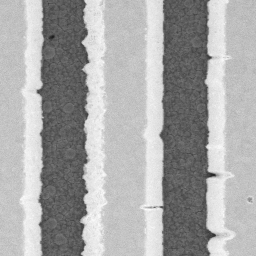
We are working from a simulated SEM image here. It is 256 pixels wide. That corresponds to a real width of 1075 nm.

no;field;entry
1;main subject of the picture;one or a few lines or trenches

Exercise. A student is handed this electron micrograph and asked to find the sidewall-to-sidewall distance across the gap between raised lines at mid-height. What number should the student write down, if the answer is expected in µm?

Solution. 0.248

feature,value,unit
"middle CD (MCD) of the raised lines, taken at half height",0.26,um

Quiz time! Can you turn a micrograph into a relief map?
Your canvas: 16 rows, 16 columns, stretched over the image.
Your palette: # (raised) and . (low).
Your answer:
##....####...###
##....####...###
##....####...###
##....####....##
##....####...###
##....####...###
##....####...###
##....####...###
##....####...###
##....####...###
##....####....##
##....####....##
##....####...###
##....####...###
##....####....##
##....####...###